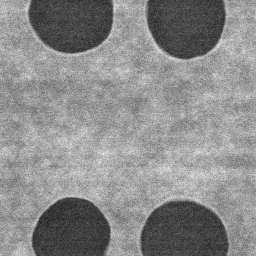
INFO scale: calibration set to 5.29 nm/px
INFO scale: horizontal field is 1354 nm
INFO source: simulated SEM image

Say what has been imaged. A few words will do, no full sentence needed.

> holes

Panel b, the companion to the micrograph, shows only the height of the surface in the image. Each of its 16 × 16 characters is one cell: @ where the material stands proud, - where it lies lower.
@@-----@@-----@@
@@-----@@-----@@
@@@---@@@@----@@
@@@@@@@@@@@--@@@
@@@@@@@@@@@@@@@@
@@@@@@@@@@@@@@@@
@@@@@@@@@@@@@@@@
@@@@@@@@@@@@@@@@
@@@@@@@@@@@@@@@@
@@@@@@@@@@@@@@@@
@@@@@@@@@@@@@@@@
@@@@@@@@@@@@@@@@
@@@@-@@@@@@@@@@@
@@@---@@@-----@@
@@-----@@-----@@
@@-----@@-----@@